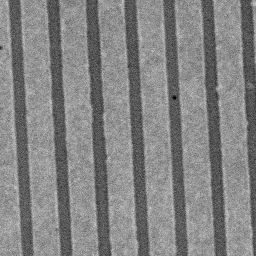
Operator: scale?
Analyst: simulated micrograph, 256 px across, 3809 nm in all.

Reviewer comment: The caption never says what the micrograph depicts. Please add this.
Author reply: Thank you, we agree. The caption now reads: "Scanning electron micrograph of parallel lines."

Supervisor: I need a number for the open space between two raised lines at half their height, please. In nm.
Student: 201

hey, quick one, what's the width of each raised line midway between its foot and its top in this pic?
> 375 nm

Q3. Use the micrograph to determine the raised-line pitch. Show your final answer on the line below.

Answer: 573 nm